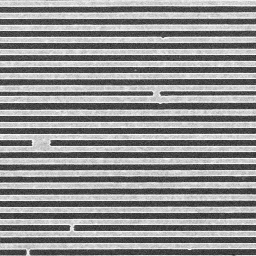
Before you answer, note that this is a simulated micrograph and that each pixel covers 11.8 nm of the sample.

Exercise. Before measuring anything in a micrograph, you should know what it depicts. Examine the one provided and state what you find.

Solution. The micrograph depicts parallel lines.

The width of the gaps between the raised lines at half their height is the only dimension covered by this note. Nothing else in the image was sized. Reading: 76.8 nanometers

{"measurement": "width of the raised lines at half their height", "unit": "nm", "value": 66.5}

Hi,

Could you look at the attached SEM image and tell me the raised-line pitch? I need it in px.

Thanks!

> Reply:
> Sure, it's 12.1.